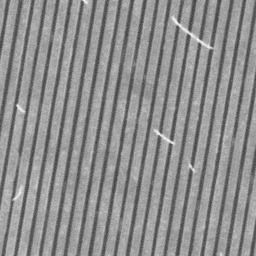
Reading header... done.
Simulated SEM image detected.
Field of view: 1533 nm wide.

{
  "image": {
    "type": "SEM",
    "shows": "parallel lines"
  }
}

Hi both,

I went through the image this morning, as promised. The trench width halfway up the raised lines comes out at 26.6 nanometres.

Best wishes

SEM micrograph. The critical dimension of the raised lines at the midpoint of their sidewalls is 0.0451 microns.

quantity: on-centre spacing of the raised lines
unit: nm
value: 73.5